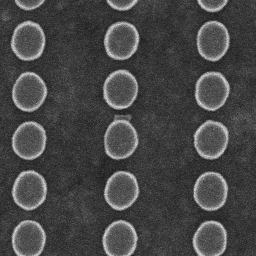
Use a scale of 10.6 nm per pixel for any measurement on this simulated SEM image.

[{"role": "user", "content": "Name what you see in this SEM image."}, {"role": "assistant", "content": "a regular array of raised bodies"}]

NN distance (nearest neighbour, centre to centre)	524	nanometers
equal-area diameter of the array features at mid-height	369	nm